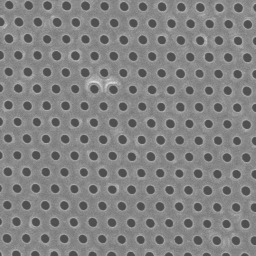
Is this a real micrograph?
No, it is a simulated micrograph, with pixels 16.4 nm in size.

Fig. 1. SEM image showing a regular array of holes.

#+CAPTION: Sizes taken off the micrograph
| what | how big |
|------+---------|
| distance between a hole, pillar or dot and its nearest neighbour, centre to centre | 309 nm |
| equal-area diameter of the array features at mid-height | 147 nm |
